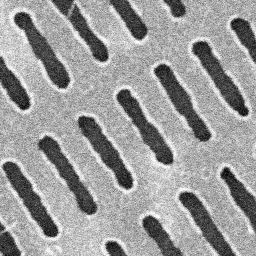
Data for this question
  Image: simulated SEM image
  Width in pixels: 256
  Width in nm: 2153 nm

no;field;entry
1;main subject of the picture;holes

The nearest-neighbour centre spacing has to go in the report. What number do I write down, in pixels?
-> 44.9